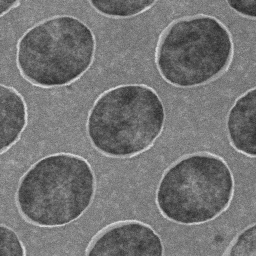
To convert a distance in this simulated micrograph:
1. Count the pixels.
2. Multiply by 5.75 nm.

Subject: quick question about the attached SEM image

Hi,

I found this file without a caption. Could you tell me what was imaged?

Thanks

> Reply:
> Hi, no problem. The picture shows holes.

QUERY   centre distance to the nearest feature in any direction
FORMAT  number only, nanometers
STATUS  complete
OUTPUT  561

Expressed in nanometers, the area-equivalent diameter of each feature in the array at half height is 410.